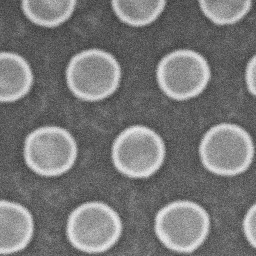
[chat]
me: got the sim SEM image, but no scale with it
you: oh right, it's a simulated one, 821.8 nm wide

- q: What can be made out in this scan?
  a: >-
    raised bodies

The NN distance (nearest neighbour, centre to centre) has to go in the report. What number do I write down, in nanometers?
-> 280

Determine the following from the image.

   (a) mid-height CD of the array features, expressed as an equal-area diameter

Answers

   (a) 156 nanometers